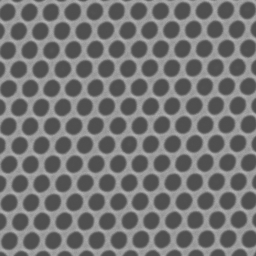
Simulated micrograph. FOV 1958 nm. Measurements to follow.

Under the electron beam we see a regular array of holes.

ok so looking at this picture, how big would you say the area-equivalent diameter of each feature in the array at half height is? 132 nm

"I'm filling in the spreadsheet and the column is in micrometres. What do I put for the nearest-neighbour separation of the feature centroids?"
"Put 0.165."